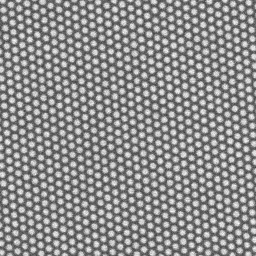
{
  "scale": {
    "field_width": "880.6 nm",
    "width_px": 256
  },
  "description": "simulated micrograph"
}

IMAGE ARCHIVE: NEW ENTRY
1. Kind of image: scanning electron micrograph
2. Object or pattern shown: a regular array of raised bodies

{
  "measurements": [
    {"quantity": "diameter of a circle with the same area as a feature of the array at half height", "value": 20.2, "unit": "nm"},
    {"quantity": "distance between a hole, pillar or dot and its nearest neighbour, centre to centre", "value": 8.78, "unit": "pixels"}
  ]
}